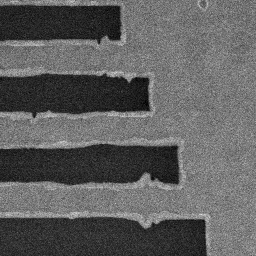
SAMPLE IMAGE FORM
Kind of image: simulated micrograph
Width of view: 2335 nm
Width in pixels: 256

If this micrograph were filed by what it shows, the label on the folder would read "one or a few lines or trenches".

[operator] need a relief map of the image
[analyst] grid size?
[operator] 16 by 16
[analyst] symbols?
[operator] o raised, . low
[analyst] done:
.......ooooooooo
........oooooooo
.......ooooooooo
oooooooooooooooo
oooooooooooooooo
.........ooooooo
.........ooooooo
oooooooooooooooo
oooooooooooooooo
...........ooooo
...........ooooo
ooo.....oo.ooooo
oooooooooooooooo
....o..ooooooooo
.............ooo
.............ooo